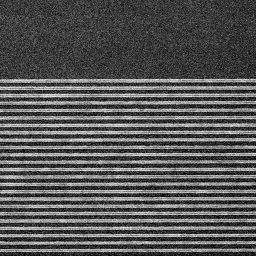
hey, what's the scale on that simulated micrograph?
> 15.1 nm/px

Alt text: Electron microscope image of parallel lines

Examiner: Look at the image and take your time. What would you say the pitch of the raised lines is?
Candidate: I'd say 111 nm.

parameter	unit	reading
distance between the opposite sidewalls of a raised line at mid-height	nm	30.1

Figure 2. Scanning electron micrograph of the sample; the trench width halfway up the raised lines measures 79.1 nanometres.